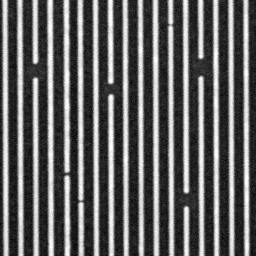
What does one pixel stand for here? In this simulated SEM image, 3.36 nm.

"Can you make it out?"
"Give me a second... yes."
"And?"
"parallel lines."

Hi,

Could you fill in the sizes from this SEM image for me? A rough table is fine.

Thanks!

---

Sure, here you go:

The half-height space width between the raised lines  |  37.7 nm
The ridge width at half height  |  14.3 nm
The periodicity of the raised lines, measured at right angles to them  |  50.5 nm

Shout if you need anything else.